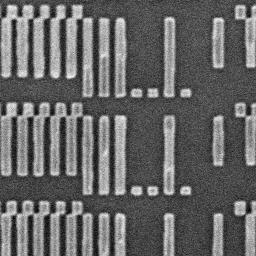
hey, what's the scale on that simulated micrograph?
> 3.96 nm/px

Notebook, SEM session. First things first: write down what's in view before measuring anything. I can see wiring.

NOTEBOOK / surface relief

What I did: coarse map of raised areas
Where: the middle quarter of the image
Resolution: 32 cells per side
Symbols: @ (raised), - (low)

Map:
-@@--@@--@@--@@----------@@-----
-@@--@@--@@--@@----------@@-----
-@@--@@--@@--@@----------@@-----
-----@@--@@--@@----------@@-----
-----@@--@@--@@----------@@-----
-----@@--@@--@@----------@@-----
-----@@--@@--@@--@@--@@--@@---@-
-----@@--@@--@@--@@--@@--@@--@@-
--------------------------------
--------------------------------
--@@----------------------------
--@@----------------------------
--@@----------------------------
-@@--@@--@@--@@----------@@-----
-@@--@@--@@--@@----------@@-----
-@@--@@--@@--@@----------@@-----
-@@--@@--@@--@@----------@@-----
-@@--@@--@@--@@----------@@-----
-@@--@@--@@--@@----------@@-----
-@@--@@--@@--@@----------@@-----
-@@--@@--@@--@@----------@@-----
-@@--@@--@@--@@----------@@-----
-@@--@@--@@--@@----------@@-----
-@@--@@--@@--@@----------@@-----
-@@--@@--@@--@@----------@@-----
-@@--@@--@@--@@----------@@-----
-@@--@@--@@--@@----------@@-----
-@@--@@--@@--@@----------@@-----
-----@@--@@--@@----------@@-----
-----@@--@@--@@----------@@-----
-----@@--@@--@@----------@@-----
-----@@--@@--@@--@@--@@--@@--@@-